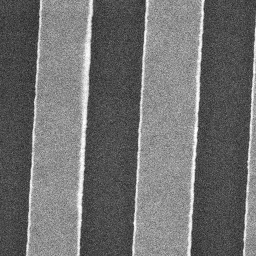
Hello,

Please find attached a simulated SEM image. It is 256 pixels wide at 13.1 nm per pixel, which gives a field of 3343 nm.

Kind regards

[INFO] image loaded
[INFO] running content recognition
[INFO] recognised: lines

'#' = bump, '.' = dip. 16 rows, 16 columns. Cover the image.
..####...####...
..####...####...
..####...####...
..####...####...
..####...###....
..####...###....
..###....###....
..###....###....
..###....###....
..###....###....
..###....###...#
..###....###...#
..###...####...#
..###...####...#
..###...####...#
..###...####...#